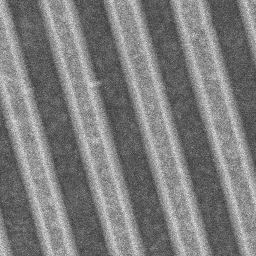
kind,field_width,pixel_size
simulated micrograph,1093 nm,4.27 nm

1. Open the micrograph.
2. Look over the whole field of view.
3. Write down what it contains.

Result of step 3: one or a few lines or trenches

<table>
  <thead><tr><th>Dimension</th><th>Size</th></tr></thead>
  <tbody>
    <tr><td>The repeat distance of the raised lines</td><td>272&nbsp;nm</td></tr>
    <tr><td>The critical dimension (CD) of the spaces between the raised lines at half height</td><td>157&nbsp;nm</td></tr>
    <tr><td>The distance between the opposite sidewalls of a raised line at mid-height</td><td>117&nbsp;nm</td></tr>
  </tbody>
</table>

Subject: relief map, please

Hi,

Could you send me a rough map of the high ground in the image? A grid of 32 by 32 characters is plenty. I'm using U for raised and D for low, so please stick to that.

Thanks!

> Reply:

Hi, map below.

UDDDDUUUUDDDDDUUUDDDDDUUUDDDDDUU
UDDDDDUUUDDDDDUUUUDDDDUUUUDDDDDU
UDDDDDUUUDDDDDUUUUDDDDUUUUDDDDDU
UDDDDDUUUUDDDDUUUUDDDDDUUUDDDDDU
UUDDDDUUUUDDDDDUUUDDDDDUUUUDDDDU
UUDDDDDUUUDDDDDUUUUDDDDUUUUDDDDD
UUDDDDDUUUDDDDDUUUUDDDDUUUUDDDDD
UUUDDDDUUUUDDDDDUUUDDDDDUUUDDDDD
UUUDDDDDUUUDDDDDUUUDDDDDUUUUDDDD
UUUDDDDDUUUDDDDDUUUUDDDDUUUUDDDD
UUUDDDDDUUUUDDDDUUUUDDDDDUUUDDDD
UUUUDDDDUUUUDDDDDUUUDDDDDUUUUDDD
UUUUDDDDDUUUDDDDDUUUDDDDDUUUUDDD
DUUUDDDDDUUUDDDDDUUUUDDDDUUUUDDD
DUUUDDDDDUUUUDDDDDUUUDDDDDUUUDDD
DUUUUDDDDDUUUDDDDDUUUDDDDDUUUUDD
DDUUUDDDDDUUUDDDDDUUUUDDDDUUUUDD
DDUUUDDDDDUUUUDDDDUUUUDDDDDUUUDD
DDUUUUDDDDUUUUDDDDDUUUDDDDDUUUUD
DDUUUUDDDDDUUUDDDDDUUUDDDDDUUUUD
DDDUUUDDDDDUUUDDDDDUUUUDDDDUUUUD
DDDUUUDDDDDUUUUDDDDUUUUDDDDDUUUD
DDDUUUUDDDDDUUUDDDDDUUUDDDDDUUUU
DDDDUUUDDDDDUUUDDDDDUUUUDDDDUUUU
DDDDUUUDDDDDUUUUDDDDUUUUDDDDDUUU
DDDDUUUUDDDDUUUUDDDDDUUUDDDDDUUU
DDDDUUUUDDDDDUUUDDDDDUUUDDDDDUUU
DDDDDUUUDDDDDUUUDDDDDUUUUDDDDUUU
DDDDDUUUDDDDDUUUUDDDDUUUUDDDDDUU
DDDDDUUUUDDDDDUUUDDDDDUUUDDDDDUU
UDDDDDUUUDDDDDUUUDDDDDUUUUDDDDUU
UDDDDDUUUDDDDDUUUUDDDDUUUUDDDDDU